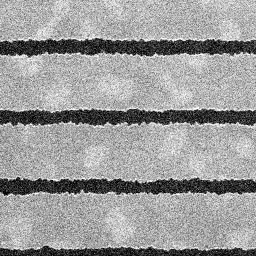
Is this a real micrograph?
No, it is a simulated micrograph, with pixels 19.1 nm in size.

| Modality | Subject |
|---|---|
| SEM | one or a few lines or trenches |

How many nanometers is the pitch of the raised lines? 1320